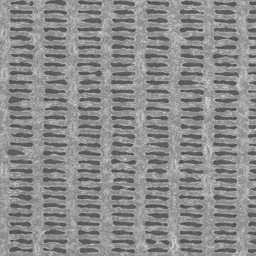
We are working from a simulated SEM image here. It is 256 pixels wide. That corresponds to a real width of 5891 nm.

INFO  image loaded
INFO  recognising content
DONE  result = a regular array of holes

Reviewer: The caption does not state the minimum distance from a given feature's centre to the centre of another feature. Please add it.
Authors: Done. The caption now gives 200 nm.